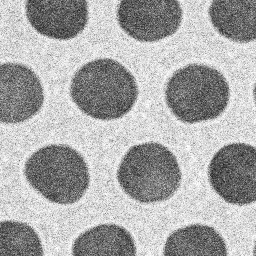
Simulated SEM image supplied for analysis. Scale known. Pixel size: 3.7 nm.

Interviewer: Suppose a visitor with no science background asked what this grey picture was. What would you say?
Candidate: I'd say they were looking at holes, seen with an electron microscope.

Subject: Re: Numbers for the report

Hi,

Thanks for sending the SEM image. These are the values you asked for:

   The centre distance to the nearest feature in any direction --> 0.34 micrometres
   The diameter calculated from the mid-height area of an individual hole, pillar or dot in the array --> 0.235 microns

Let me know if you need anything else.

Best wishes